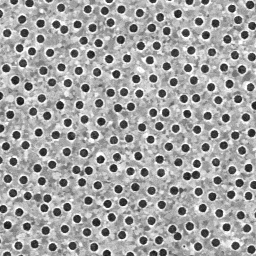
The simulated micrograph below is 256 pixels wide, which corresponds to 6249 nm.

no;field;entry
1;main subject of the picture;a regular array of holes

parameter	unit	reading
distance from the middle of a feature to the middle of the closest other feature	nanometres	374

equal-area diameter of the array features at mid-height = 215 nm